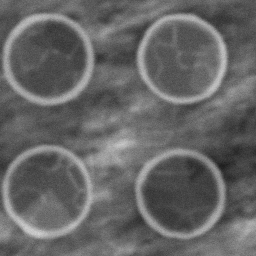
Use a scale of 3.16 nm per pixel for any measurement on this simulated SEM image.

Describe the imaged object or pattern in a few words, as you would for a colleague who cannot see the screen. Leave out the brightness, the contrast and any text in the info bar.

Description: raised bodies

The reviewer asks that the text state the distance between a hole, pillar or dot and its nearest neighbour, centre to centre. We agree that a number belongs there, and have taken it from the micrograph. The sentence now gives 419 nanometres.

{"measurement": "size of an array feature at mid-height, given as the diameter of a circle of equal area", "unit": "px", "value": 85.1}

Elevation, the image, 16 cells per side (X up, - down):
----------------
--XX------XXX---
-XXXX----XXXXX--
XXXXXX---XXXXX--
XXXXX----XXXXX--
-XXXX-----XXX---
----------------
----------------
----------------
--XX------------
-XXXX----XXXX---
XXXXXX---XXXXX--
XXXXXX---XXXXX--
-XXXX----XXXX---
--XX------XXX---
----------------